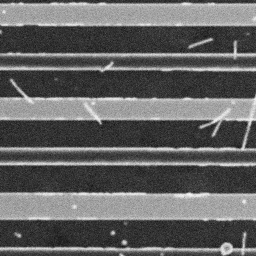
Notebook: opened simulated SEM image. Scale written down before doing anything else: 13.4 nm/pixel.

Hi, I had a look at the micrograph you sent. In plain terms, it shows lines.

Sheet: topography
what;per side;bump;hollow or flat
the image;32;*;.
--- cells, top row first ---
.*....*..**.*.........**........
********************************
********************************
................................
................................
................................
................................
********************************
********************************
................................
................................
................................
********************************
********************************
********************************
................................
................................
................................
................................
********************************
****..**************************
................................
................................
................................
********************************
********************************
********************************
................................
................................
................................
............................*...
********************************